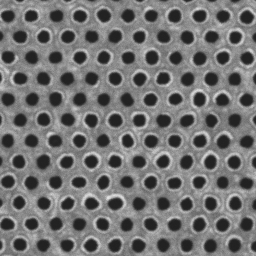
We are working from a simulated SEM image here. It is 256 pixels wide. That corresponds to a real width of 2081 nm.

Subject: a regular array of holes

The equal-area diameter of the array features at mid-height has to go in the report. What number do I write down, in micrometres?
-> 0.108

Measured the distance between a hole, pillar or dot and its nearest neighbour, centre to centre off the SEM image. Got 190 nm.